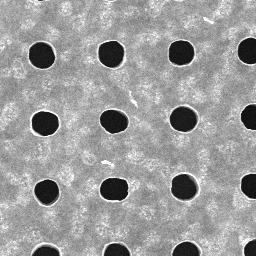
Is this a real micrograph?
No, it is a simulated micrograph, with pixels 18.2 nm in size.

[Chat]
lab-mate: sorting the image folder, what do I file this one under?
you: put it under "a regular array of holes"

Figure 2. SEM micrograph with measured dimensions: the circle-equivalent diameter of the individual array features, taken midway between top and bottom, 26.2 pixels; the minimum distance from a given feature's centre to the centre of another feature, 1.22 µm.